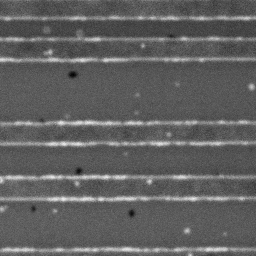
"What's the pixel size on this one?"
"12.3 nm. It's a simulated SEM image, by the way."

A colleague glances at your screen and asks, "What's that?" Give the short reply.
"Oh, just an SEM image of lines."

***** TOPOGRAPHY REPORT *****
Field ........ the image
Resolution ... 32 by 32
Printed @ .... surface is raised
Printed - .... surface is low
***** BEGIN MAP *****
@@@@@@@@@@@@@@@@@@@@@@@@@@@@@@@@
@@@@@@@@@@@@@@@@@@@@@@@@@@@@@@@@
--------------------------------
--------------------------------
--------------------------------
@@@@@@@@@@@@@@@@@@@@@@@@@@@@@@@@
@@@@@@@@@@@@@@@@@@@@@@@@@@@@@@@@
@@@@@@@@@@@@@@@@-----@@--@------
--------------------------------
--------------------------------
--------------------------------
--------------------------------
--------------------------------
--------------------------------
--------------------------------
@@@@@@@@@@@@@@@@@@@@@@@@@@@@@@@@
@@@@@@@@@@@@@@@@@@@@@@@@@@@@@@@@
@@@@@@@@@@@@@@@@@@@@@@@@@@@@@@@@
--------------------------------
--------------------------------
--------------------------------
--------------------------------
@@@@@@@@@@@@@@@@@@@@@@@@@@@@@@@@
@@@@@@@@@@@@@@@@@@@@@@@@@@@@@@@@
@@@@@@@@@@@@@@@@@@@@@@@@@@@@@@@@
--------------------------------
--------------------------------
--------------------------------
--------------------------------
--------------------------------
--------------------------------
@@@@@@@@@@@@@@@@@@@@@@@@@@@@@@@@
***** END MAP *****